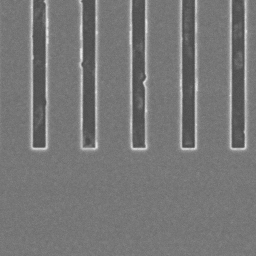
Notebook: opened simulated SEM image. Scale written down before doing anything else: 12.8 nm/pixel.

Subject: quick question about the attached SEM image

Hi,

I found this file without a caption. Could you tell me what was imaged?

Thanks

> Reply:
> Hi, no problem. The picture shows parallel lines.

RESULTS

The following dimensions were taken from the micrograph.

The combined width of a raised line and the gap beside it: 49.8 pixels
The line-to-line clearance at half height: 173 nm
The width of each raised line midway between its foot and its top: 471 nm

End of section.